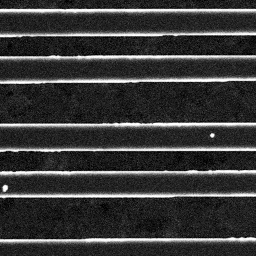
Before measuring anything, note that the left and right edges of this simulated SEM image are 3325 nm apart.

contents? lines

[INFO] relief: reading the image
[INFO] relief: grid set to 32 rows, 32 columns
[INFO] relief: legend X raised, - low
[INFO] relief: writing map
--------------------------------
XXXXXXXXXXXXXXXXXXXXXXXXXXXXXXXX
XXXXXXXXXXXXXXXXXXXXXXXXXXXXXXXX
XXXXXXXXXXXXXXXXXXXXXXXXXXXXXXXX
X-------------------------------
--------------------------------
--------------------------------
XXXXXXXXXXXXXXXXXXXXXXXXXXXXXXXX
XXXXXXXXXXXXXXXXXXXXXXXXXXXXXXXX
XXXXXXXXXXXXXXXXXXXXXXXXXXXXXXXX
--------------------------------
--------------------------------
--------------------------------
--------------------------------
--------------------------------
-----------------X-XX-XXXXXXXXXX
XXXXXXXXXXXXXXXXXXXXXXXXXXXXXXXX
XXXXXXXXXXXXXXXXXXXXXXXXXXXXXXXX
XXXXXXXXXXXXXXXXXXXXXXXXXXXXXXXX
--------------------------------
--------------------------------
--XXXXXXXXXXXXXXXXXXXXXXXXXXXXXX
XXXXXXXXXXXXXXXXXXXXXXXXXXXXXXXX
XXXXXXXXXXXXXXXXXXXXXXXXXXXXXXXX
XXXXXXXXXXXXXXX-XXXX------------
--------------------------------
--------------------------------
--------------------------------
--------------------------------
--------------------------------
XXXXXXXXXXXXXXXXXXXXXXXXXXXXXXXX
XXXXXXXXXXXXXXXXXXXXXXXXXXXXXXXX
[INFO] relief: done